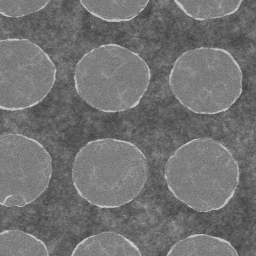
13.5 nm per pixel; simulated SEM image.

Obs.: raised bodies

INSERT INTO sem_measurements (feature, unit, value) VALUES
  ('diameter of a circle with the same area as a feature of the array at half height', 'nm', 957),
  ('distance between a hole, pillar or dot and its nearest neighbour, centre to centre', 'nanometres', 1260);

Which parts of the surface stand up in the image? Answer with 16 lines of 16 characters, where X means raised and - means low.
XXX--XXXX--XXXX-
----------------
X---------------
XXX--XXXX--XXX--
XXX--XXXX--XXXX-
XXX--XXXX--XXXX-
XX----XX---XXX--
----------------
X---------------
XXX--XXXX--XXX--
XXX--XXXX-XXXXX-
XXX--XXXX--XXXX-
------XX---XXX--
----------------
X---------------
XXX--XXX---XXXX-